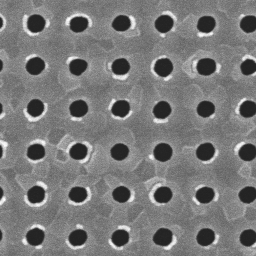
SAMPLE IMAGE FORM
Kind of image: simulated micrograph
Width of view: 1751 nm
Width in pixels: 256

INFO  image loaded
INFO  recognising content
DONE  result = a regular array of holes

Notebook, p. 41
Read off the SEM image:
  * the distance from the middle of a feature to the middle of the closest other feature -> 288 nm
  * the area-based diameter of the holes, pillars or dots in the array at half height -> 126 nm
